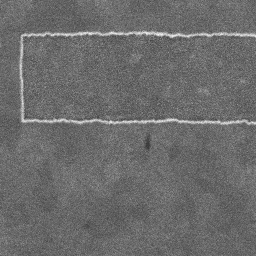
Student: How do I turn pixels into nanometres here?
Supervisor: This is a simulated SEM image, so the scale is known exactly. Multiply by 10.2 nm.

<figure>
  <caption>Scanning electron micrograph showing one or a few lines or trenches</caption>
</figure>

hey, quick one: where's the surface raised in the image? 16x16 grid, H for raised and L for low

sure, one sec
HHHHHHHHHHHHHHHH
HHHHHHHHHHHHHHHH
HHLLLLLLLLLLLLLL
HLLLLLLLLLLLLLLL
HLLLLLLLLLLLLLLL
HLLLLLLLLLLLLLLL
HLLLLLLLLLLLLLLL
HHLLLLLLLLLLLLLL
HHHHHHHHHHHHHHHH
HHHHHHHHHHHHHHHH
HHHHHHHHHHHHHHHH
HHHHHHHHHHHHHHHH
HHHHHHHHHHHHHHHH
HHHHHHHHHHHHHHHH
HHHHHHHHHHHHHHHH
HHHHHHHHHHHHHHHH